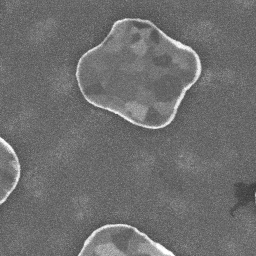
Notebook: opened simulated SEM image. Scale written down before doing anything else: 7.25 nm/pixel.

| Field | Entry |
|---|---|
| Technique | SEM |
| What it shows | raised bodies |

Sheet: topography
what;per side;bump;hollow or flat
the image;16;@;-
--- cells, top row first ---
----------------
-------@@@------
------@@@@@-----
-----@@@@@@@----
-----@@@@@@@----
-----@@@@@@@----
------@@@@@-----
--------@@@-----
----------------
@---------------
@---------------
@---------------
----------------
----------------
------@@@-------
-----@@@@@------